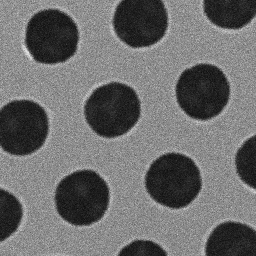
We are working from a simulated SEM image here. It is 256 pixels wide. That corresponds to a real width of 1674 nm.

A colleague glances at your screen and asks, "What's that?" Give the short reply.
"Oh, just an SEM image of holes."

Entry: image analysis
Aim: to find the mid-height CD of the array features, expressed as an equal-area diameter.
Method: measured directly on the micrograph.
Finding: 368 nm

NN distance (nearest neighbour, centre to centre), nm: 608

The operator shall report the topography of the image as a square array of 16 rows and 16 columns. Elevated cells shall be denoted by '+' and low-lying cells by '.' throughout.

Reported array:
+++++++...+++...
++...++...+++..+
++...+++..++++++
++..++++++++++++
+++++++++++...++
++++++..+++...++
..+++....++...++
...++....+++++++
...+++..++++++++
..+++++++++++++.
+++++++++...+++.
++++...++....++.
.++....+++..++++
.+++..++++++++++
.++++++++++++...
++++++++..+++...